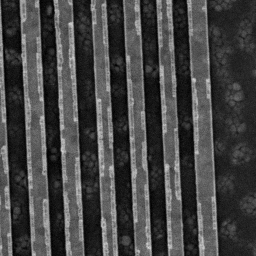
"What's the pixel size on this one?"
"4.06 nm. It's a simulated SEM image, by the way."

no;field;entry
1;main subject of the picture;parallel lines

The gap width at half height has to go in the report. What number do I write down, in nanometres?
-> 72.4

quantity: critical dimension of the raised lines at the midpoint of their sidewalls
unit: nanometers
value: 67.6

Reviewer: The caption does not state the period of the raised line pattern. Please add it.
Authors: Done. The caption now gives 136 nm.